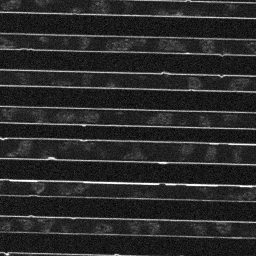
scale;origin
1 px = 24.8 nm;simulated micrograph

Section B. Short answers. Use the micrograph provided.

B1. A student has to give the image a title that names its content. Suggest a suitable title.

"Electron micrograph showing parallel lines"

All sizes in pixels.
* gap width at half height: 16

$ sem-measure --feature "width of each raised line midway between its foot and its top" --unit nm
512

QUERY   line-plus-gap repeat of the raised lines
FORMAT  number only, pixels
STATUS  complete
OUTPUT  36.5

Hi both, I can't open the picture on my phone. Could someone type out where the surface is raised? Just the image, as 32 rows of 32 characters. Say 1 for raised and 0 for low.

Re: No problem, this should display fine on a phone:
00000000000000000000000000000000
00000000000000000000000000000000
11111111111111111111111111111111
11111111111111111111111111111111
00000000000001111111111111111111
00000000000000000000000000000000
11111111111110000000000000000000
11111111111111111111111111111111
11111111111111111111111111111111
00000000000000000000000000010000
00000000000000000000000000000000
11111111111111111111111111111100
11111111111111111111111111111111
00000001111111111111111111111111
00000000000000000000000000000000
11100000000000000000000000000000
11111111111111111111111111111111
00000000001111111111111111111111
00000000000000000000000000000000
00000000000000000000000000000000
11111111111111111111111111111000
11111111111111111111111111111111
01111111111111111111111111111111
00000000000000000000000000000000
11011000000000000000000000000000
11111111111111111111111111111111
11111111111111111111111111111111
00000000000000000000000111111111
00000000000000000000000000000000
11111111111111111110000000000000
11111111111111111111111111111111
11111111111111111111111111111111